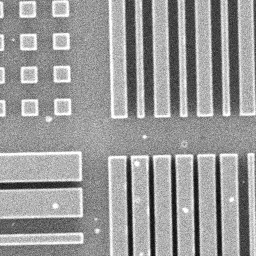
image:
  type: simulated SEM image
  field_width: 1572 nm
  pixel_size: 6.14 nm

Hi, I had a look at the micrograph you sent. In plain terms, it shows groups of lines, slits or small figures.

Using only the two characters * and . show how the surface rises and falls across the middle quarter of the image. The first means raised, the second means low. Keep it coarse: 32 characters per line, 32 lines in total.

............***...**...***...*..
*...........***...**...***...*..
*...........***...**...***...*..
*...........***...**...***...*..
............***...**...***...*..
............***...**...***...**.
............***...**...***...**.
............***...**...***...**.
............****..**...***...**.
**..........****...*...***...**.
**..........****...*...***...**.
**..........****...*...***...**.
*...........****...*...***...**.
................................
................................
................................
................................
................................
................................
................................
................................
................................
****............................
****.......****..****..****.****
****.......****..****..****.****
****.......****..****..****.****
****.......****..****..****.****
****.......****..****..****.****
****.......****..****..****.****
...........****..****..****.****
...........****..****..****.****
****.......*****.****..****.****